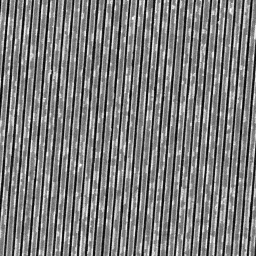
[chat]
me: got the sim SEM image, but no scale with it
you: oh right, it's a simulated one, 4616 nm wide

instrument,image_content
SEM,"parallel lines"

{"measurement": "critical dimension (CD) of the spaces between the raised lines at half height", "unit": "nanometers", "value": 49.4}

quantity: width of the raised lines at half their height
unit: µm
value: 0.0831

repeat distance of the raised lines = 146 nm